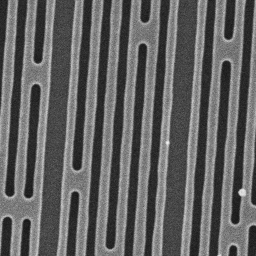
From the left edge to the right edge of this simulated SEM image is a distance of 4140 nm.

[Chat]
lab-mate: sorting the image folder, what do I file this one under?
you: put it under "groups of lines, slits or small figures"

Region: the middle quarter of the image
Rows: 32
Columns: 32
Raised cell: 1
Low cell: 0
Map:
00110011000110001100011000100000
00110011000110001100111000100000
00100011000110001100111001100000
00100011000110001100111001100000
01100011000110001100111001100000
01100011000110011100111001100000
01100011000110011100110001100000
01100011001110011100110001100000
01100011001110011100110001100000
01100011001110011000110001100000
01100011001110011000110001100000
01100111001110011000110001100000
01100111001100011000110001100000
01100111001100011000110001000000
01100111001100011000110001000000
01100111001100011000110011000000
01000111001100011000110011000001
01000110001100011001110011000001
01000110001100011001110011000001
01000110001100011001110011000001
11000110001100111001110011000001
11000110001100111001110011000001
11000110001100111001110011000001
11000110001100111001100011000001
11000110001100111001100011000001
11001110011100111001100011000001
11101110011000110001100011000001
11111110011000110001100011000001
11111110011000110001100011000001
11111100011000110001100010000001
11111100011000110001100010000001
11111100011000110001100110000001